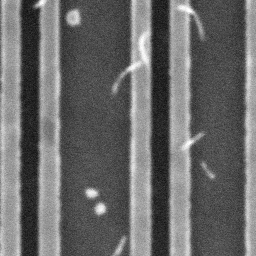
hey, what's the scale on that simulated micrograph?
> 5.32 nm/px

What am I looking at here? lines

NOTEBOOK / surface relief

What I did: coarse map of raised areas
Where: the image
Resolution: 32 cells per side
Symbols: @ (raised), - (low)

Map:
@@---@@----------@@--@@@-------@
@@---@@----------@@--@@@-------@
@@---@@----------@@--@@@-------@
@@---@@----------@@--@@@-------@
@@---@@----------@@--@@@-------@
@@---@@----------@@--@@@-------@
@@---@@----------@@--@@@-------@
@@---@@----------@@--@@@-------@
@@---@@---------@@@--@@@-------@
@@---@@----------@@--@@@-------@
@@---@@----------@@--@@@-------@
@@---@@----------@@--@@@-------@
@@---@@----------@@--@@@-------@
@@---@@----------@@--@@@-------@
@@---@@---------@@@--@@@-------@
@@---@@----------@@--@@@-------@
@@---@@----------@@--@@@-------@
@@---@@----------@@--@@@-------@
@@---@@----------@@--@@@-------@
@@---@@----------@@--@@@-------@
@@---@@----------@@--@@@-------@
@@---@@---------@@@--@@@-------@
@@---@@---------@@@--@@@-------@
@@---@@---------@@@--@@@-------@
@@---@@---------@@@--@@@-------@
@@---@@---------@@@--@@@-------@
@@---@@---------@@@--@@@-------@
@@---@@---------@@@--@@@-------@
@@---@@---------@@@--@@@-------@
@@---@@---------@@@--@@@-------@
@@---@@---------@@@--@@@-------@
@@---@@---------@@@--@@@-------@